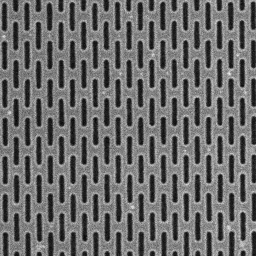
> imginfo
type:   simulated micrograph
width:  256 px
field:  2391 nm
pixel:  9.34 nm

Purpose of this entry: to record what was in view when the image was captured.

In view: a regular array of holes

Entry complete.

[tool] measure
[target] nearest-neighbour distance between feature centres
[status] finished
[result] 203 nm